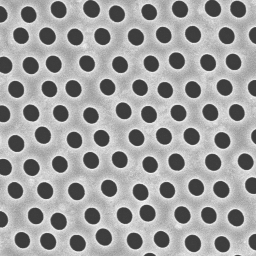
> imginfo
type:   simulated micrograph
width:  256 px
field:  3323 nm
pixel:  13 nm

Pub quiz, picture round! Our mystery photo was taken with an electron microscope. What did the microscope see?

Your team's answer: a regular array of holes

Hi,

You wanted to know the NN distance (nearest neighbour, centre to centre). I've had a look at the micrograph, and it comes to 344 nm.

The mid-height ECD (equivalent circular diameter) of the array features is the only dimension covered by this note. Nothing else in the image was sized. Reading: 216 nanometres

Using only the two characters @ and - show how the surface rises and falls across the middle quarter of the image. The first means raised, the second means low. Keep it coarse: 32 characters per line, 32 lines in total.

@@@@----@@@@----@@@@----@@@---@@
@@@@@--@@@@@@---@@@@@--@@@@@-@@@
@@@@@@@@@@@@@@@@@@@@@@@@@@@@@@@@
@@@@@@@@@@@@@@@@@@@@@@@@@@@@@@@@
@---@@@@@---@@@@@---@@@@@-@@@@@-
----@@@@@----@@@@----@@----@@@--
----@@@@@----@@@@----@@----@@@--
@---@@@@@@--@@@@@@--@@@@---@@@--
@@@@@@@@@@@@@@@@@@@@@@@@@-@@@@@@
@@@@@@@@@@@@@@@@@@@@@@@@@@@@@@@@
@@@@@@@@@@@@@----@@@@@@@@@@---@@
-@@@@---@@@@@----@@----@@@@---@@
-@@@@----@@@@----@@----@@@@----@
-@@@@----@@@@@--@@@@---@@@@---@@
@@@@@@--@@@@@@@@@@@@---@@@@@@@@@
@@@@@@@@@@@@@@@@@@@@@@@@@@@@@@@@
@@@@@@@@@@@@@@@@@--@@@@---@@@@--
@---@@@@---@@@@@----@@@----@@@--
@----@@-----@@@@----@@@----@@@--
@----@@@---@@@@@@---@@@@---@@@@-
@---@@@@@-@@@@@@@@-@@@@@@@@@@@@@
@@@@@@@@@@@@@@@@@@@@@@@@@@@@@@@@
@@@@@---@@@@---@@@@@@@@@@@@--@@@
@@@@@----@@@----@@@@--@@@@----@@
-@@@@----@@@----@@@@---@@@----@@
-@@@@----@@@@---@@@@----@@----@@
-@@@@@@@@@@@@@@@@@@@---@@@@--@@@
@@@@@@@@@@@@@@@@@@@@@@@@@@@@@@@@
@@@@@@@@@@@@@@@@@@@@@@@@@@@@@@@@
@@@@@@@@@@---@@@@@@@@@@@@-@@@@@-
@----@@@@----@@@@@--@@@@---@@@@-
@----@@@@----@@@@----@@@----@@@-